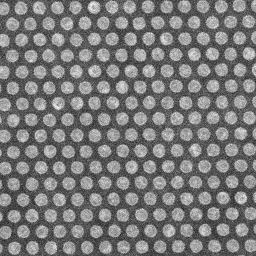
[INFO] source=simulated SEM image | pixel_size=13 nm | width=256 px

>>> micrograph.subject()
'a regular array of raised bodies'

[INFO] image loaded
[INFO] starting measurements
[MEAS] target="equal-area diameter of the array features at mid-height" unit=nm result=156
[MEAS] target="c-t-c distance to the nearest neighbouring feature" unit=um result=0.233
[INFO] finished